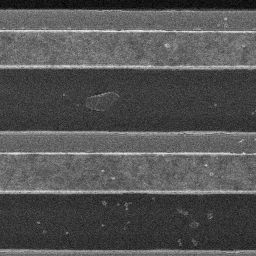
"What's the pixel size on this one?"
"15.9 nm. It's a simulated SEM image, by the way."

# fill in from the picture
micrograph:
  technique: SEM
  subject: lines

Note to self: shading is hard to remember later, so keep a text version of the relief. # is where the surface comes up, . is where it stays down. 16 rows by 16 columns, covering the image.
................
################
################
################
................
................
................
................
################
################
################
################
................
................
................
................